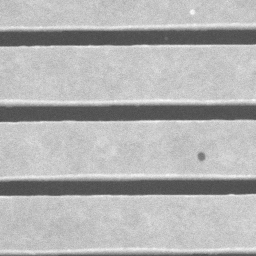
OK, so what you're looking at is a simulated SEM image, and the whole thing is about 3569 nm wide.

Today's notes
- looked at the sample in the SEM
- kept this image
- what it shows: lines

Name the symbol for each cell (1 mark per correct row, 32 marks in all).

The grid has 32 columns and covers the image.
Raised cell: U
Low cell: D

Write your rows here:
UUUUUUUUUUUUUUUUUUUUUUUUUUUUUUUU
UUUUUUUUUUUUUUUUUUUUUUUUUUUUUUUU
UUUUUUUUUUUUUUUUUUUUUUUUUUUUUUUU
UUUUUUUUUUUUUUUUUUUUUUUUUUUUUDUU
DDDDDDDDDDDDDDDDDDDDDDDDDDDDDDDD
DDDDDDDDDDDDDDDDDDDDDDDDDDDDDDDD
UUUUUUUUUUUUUUUUUUUUUUUUUUUUUUUU
UUUUUUUUUUUUUUUUUUUUUUUUUUUUUUUU
UUUUUUUUUUUUUUUUUUUUUUUUUUUUUUUU
UUUUUUUUUUUUUUUUUUUUUUUUUUUUUUUU
UUUUUUUUUUUUUUUUUUUUUUUUUUUUUUUU
UUUUUUUUUUUUUUUUUUUUUUUUUUUUUUUU
UUUUUUUUUUUUUUUUUUUUUUUUUUUUUUUU
DDDDDDDDDDDDDDDDDDDDDDDDDDDDDDDD
DDDDDDDDDDDDDDDDDDDDDDDDDDDDDDDD
UUUUUUUUUUUUUUUUUUUUUUUUUUUUUUUU
UUUUUUUUUUUUUUUUUUUUUUUUUUUUUUUU
UUUUUUUUUUUUUUUUUUUUUUUUUUUUUUUU
UUUUUUUUUUUUUUUUUUUUUUUUUUUUUUUU
UUUUUUUUUUUUUUUUUUUUUUUUUUUUUUUU
UUUUUUUUUUUUUUUUUUUUUUUUUUUUUUUU
UUUUUUUUUUUUUUUUUUUUUUUUUUUUUUUU
UDDDDDDDDDDDDDDDDDDDDDDDDDDDDDDD
DDDDDDDDDDDDDDDDDDDDDDDDDDDDDDDD
DDDDDDDDUUDUUUUUUUUUUUUUUUUUUUUU
UUUUUUUUUUUUUUUUUUUUUUUUUUUUUUUU
UUUUUUUUUUUUUUUUUUUUUUUUUUUUUUUU
UUUUUUUUUUUUUUUUUUUUUUUUUUUUUUUU
UUUUUUUUUUUUUUUUUUUUUUUUUUUUUUUU
UUUUUUUUUUUUUUUUUUUUUUUUUUUUUUUU
UUUUUUUUUUUUUUUUUUUUUUUUUUUUUUUU
UUUUUUUUUUUUUUUUUUUUUUUUUUUUUUUU